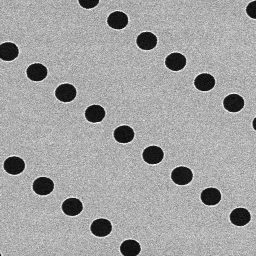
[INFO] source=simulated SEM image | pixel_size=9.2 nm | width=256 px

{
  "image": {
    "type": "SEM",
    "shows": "a regular array of holes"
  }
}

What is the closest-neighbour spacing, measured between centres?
0.327 µm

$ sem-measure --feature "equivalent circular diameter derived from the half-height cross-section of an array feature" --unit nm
184